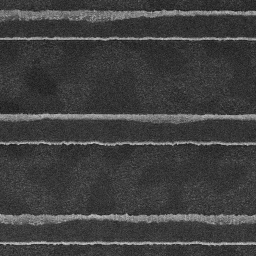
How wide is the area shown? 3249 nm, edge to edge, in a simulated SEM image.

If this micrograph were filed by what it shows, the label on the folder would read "lines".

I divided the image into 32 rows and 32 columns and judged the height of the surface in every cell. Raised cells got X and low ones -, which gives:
--------------------------------
--------------------------------
XXXXXXXXXXXXXXXXXXXXXXXXXXXXXXXX
XXXXXXXXXXXXXXXXXXXXXXXXXXXXXXXX
XXXXXXXXXXXXXXXXXXXXXXXXXXXXXXXX
--------------------------------
--------------------------------
--------------------------------
--------------------------------
--------------------------------
--------------------------------
--------------------------------
--------------------------------
--------------------------------
----XXXXX-XX-X-X----------------
XXXXXXXXXXXXXXXXXXXXXXXXXXXXXXXX
XXXXXXXXXXXXXXXXXXXXXXXXXXXXXXXX
XXXXXXXXXXXXXXXXXXXXXXXXXXXXXXXX
--------------------------------
--------------------------------
--------------------------------
--------------------------------
--------------------------------
--------------------------------
--------------------------------
--------------------------------
--------------------------------
XXXXXXXXXXXXXXXXXXXXXXXXXXXXXXXX
XXXXXXXXXXXXXXXXXXXXXXXXXXXXXXXX
XXXXXXXXXXXXXXXXXXXXXXXXXXXXXXXX
--X-------------X--------XXXXXXX
--------------------------------